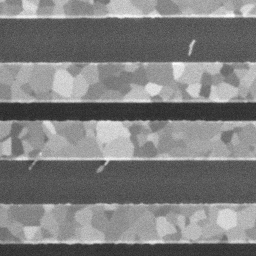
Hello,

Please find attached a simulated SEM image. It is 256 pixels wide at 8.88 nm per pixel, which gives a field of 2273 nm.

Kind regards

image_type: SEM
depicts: lines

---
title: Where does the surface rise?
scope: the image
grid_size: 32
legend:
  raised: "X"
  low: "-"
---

XXXXXXXXXXXXXXXXXXXXXXXXXXXXXXXX
XXXXXXXXXXXXXXXXXXXXXXXXXXXXXXXX
--------------------------------
--------------------------------
--------------------------------
--------------------------------
--------------------------------
--------------------------------
XXXXXXXXXXXXXXXXXXXXXXXXXXXXXXXX
XXXXXXXXXXXXXXXXXXXXXXXXXXXXXXXX
XXXXXXXXXXXXXXXXXXXXXXXXXXXXXXXX
XXXXXXXXXXXXXXXXXXXXXXXXXXXXXXXX
XXXXXXXXXXXXXXXXXXXXXXXXXXXXXXXX
--------------------------------
--------------------------------
XXXXXXXXXXXXXXXXXXXXXXXXXXXXXXXX
XXXXXXXXXXXXXXXXXXXXXXXXXXXXXXXX
XXXXXXXXXXXXXXXXXXXXXXXXXXXXXXXX
XXXXXXXXXXXXXXXXXXXXXXXXXXXXXXXX
XXXXXXXXXXXXXXXXXXXXXXXXXXXXXXXX
--------------------------------
--------------------------------
--------------------------------
--------------------------------
--------------------------------
--------------------------------
XXXXXXXXXXXXXXXXXXXXXXXXXXXXXXXX
XXXXXXXXXXXXXXXXXXXXXXXXXXXXXXXX
XXXXXXXXXXXXXXXXXXXXXXXXXXXXXXXX
XXXXXXXXXXXXXXXXXXXXXXXXXXXXXXXX
--------------------------------
--------------------------------